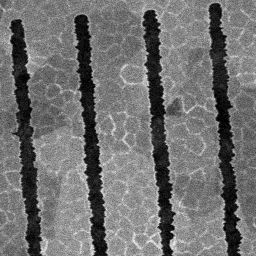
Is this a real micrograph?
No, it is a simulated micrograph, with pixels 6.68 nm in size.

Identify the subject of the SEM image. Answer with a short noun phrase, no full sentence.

one or a few lines or trenches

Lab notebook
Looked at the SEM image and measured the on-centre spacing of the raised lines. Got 444 nm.